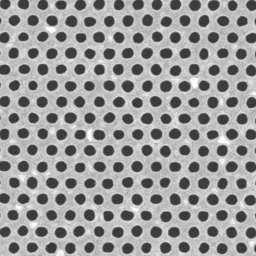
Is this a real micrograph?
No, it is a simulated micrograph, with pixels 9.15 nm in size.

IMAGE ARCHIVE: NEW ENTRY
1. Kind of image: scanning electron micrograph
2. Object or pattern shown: a regular array of holes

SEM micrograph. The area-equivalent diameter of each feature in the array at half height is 0.103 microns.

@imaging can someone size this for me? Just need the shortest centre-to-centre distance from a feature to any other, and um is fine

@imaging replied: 0.167